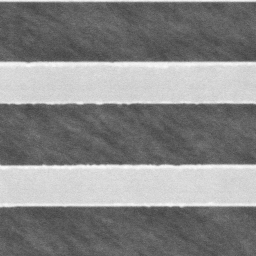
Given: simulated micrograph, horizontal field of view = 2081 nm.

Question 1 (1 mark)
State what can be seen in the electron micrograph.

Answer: lines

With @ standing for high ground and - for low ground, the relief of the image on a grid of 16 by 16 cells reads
----------------
----------------
----------------
----------------
@@@@@@@@@@@@@@@@
@@@@@@@@@@@@@@@@
----------------
----------------
----------------
----------------
@@@@@@@@@@@@@@@@
@@@@@@@@@@@@@@@@
@@@@@@@@@@@@@@@@
----------------
----------------
----------------